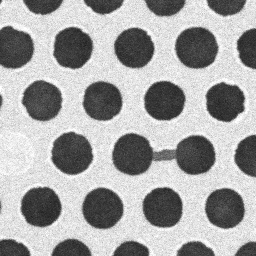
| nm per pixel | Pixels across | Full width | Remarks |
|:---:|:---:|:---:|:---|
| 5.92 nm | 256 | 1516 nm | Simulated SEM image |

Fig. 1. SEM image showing a regular array of holes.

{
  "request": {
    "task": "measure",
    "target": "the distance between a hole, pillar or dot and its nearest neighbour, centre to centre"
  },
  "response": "359 nanometers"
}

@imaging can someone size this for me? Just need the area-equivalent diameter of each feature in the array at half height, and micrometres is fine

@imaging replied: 0.241